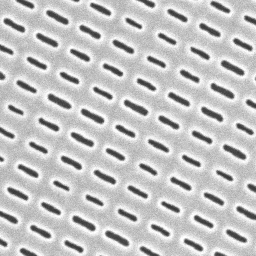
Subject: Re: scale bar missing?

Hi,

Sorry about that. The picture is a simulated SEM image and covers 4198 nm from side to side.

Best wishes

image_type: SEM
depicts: a regular array of holes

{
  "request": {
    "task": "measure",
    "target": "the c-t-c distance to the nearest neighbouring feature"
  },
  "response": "414 nanometers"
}